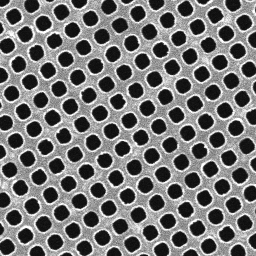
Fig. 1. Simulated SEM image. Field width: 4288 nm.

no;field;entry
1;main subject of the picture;a regular array of holes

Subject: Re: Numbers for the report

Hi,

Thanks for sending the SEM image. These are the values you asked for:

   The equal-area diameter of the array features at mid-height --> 259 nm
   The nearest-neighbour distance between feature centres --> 352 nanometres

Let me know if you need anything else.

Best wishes